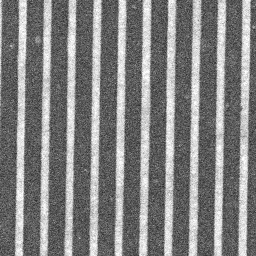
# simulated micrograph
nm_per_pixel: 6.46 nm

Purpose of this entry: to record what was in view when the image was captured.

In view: parallel lines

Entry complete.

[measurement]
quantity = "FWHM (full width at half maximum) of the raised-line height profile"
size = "45.2 nanometers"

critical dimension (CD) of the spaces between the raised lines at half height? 118 nm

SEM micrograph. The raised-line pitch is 0.161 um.